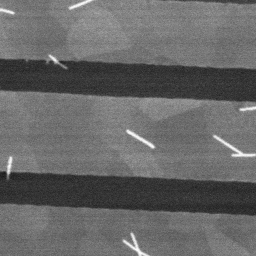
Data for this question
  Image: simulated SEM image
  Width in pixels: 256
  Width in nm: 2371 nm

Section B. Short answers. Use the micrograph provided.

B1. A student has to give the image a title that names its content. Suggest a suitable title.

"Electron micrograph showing lines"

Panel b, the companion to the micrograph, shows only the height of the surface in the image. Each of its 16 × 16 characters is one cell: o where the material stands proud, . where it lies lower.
oooooooooooooooo
oooooooooooooooo
oooooooooooooooo
oooooooooooooooo
................
................
oooooooooooooooo
oooooooooooooooo
oooooooooooooooo
oooooooooooooooo
oooooooooooooooo
................
................
oooooooooooooooo
oooooooooooooooo
oooooooooooooooo